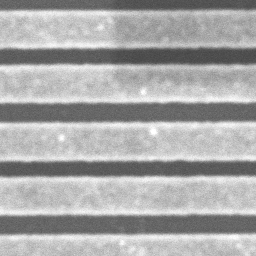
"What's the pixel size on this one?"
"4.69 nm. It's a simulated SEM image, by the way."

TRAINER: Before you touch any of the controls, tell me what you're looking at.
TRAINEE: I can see lines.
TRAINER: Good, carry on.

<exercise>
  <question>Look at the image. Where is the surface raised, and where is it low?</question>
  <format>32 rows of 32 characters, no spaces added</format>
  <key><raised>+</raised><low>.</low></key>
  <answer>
................................
++++++++++++++++++++++++++++++++
++++++++++++++++++++++++++++++++
++++++++++++++++++++++++++++++++
++++++++++++++++++++++++++++++++
++++++++++++++++++++++++++++++++
................................
................................
++++++++++++++++++++++++++++++++
++++++++++++++++++++++++++++++++
++++++++++++++++++++++++++++++++
++++++++++++++++++++++++++++++++
++++++++++++++++++++++++++++++++
................................
................................
++++++++++++++++++++++++++++++++
++++++++++++++++++++++++++++++++
++++++++++++++++++++++++++++++++
++++++++++++++++++++++++++++++++
++++++++++++++++++++++++++++++++
................................
................................
++++++++++++++++++++++++++++++++
++++++++++++++++++++++++++++++++
++++++++++++++++++++++++++++++++
++++++++++++++++++++++++++++++++
++++++++++++++++++++++++++++++++
................................
................................
....+....+..++.+.+++++++++++++++
++++++++++++++++++++++++++++++++
++++++++++++++++++++++++++++++++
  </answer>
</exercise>